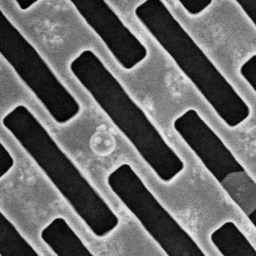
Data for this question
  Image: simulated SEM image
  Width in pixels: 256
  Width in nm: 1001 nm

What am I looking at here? holes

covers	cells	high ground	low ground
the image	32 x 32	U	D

UUDDUUUUUDDDDUUUUUDDUUUDDDUUUUDD
UUUUUUUUUUDDDDUUUDDDDUUUDUUUUUUD
DUUUUUUUUUUDDDDUUDDDDDUUUUUUUUUD
DDUUUUUUUUUDDDDDUUDDDDDUUUUUUUUU
DDDUUUUUUUUUDDDDDUUDDDDDUUUUUUUU
DDDDUUUUUUUUUDDDDDUUDDDDDUUUUUUU
DDDDDUUUUUDUUUDDDDUUUDDDDUUUUUUU
UDDDDDUUUDDDDUUDDDUUUUDDDDUUUUUD
UUDDDDUUUDDDDUUUUUUUUUUDDDDUUUDD
UUDDDDDUUDDDDDUUUUUUUUUDDDDDUUDD
UUUDDDDDUUDDDDDUUUUUUUUUDDDDDUUD
UUUUDDDDDUUDDDDDUUUUUUUUUDDDDUUU
UUUUUDDDDUUUDDDDDUUUUUUUUUDDDDUU
UUDUUUDDDDUUUDDDDDUUUUUUUUUDDDDU
UDDDUUUDDUUUUUDDDDUUUUUDDUUUDDDU
UDDDDUUUUUUUUUDDDDDUUUDDDDUUDDUU
UDDDDDUUUUUUUUUDDDDDUUDDDDDUUUUU
UUDDDDDUUUUUUUUUDDDDUUUDDDDDUUUU
DUUDDDDUUUUUUUUUUDDDDUUUDDDDUUUU
DUUUDDDDUUUUUUUUUUDDDDUUUDDDDUUU
DDUUUDDDDUUUUUUUUUDDDDDUUDDDDDUU
DUUUUUDDDDUUUUDDDUUDDDUUUUDDDDDU
UUUUUUDDDDDUUDDDDDUUUUUUUUUDDDDD
UUUUUUUDDDDDUUDDDDUUUUUUUUUUDDDD
UUUUUUUUDDDDUUUDDDDUUUUUUUUUUDDD
UUUUUUUUUDDDDUUUDDDDUUUUUUUUUUDD
UUUUUUUUUUDDDDUUUDDDDUUUUUUUUUDD
DUUUUUUDUUDDDDDUUDDDDDUUUUUUUUUD
DDUUUUDDDUUDDDUUUUDDDDDUUUUDDDUU
DDDUUDDDDDUUUUUUUUUDDDDDUUDDDDDU
DDDDUUDDDDUUUUUUUUUUDDDDDUUDDDDU
DDDDUUUDDDDUUUUUUUUUUDDDDUUUDDDD